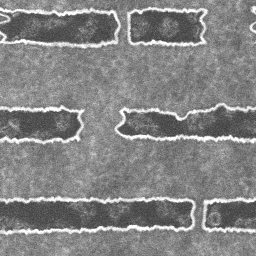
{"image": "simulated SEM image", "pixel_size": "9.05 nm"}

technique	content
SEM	one or a few lines or trenches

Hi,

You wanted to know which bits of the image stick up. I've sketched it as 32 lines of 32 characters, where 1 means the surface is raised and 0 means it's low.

00000000000000000000000000000000
11111000111111001111111111000000
01111111111111101111111110000000
11111111111111101111111111000001
11111111111111101111111110000000
00000111111110000000011110000000
00000000000000000000000000000000
00000000000000000000000000000000
00000000000000000000000000000000
00000000000000000000000000000000
00000000000000000000000000000000
00000000000000000000000000000000
00000000000000000000000000000000
00000000000000000000000000011000
11111111110000011111110111111111
11111111110000011111111111111111
11111111110000011111111111111111
01101111100000000000000000000011
00000000000000000000000000000000
00000000000000000000000000000000
00000000000000000000000000000000
00000000000000000000000000000000
00000000000000000000000000000000
00000000000000000000000000000000
00000000000000000000000000000000
11111111111111111111111100111111
11111111111111111111111100111111
11111111111111111111111101111111
11111111111111110110111100111111
00000000000000000000000000000000
00000000000000000000000000000000
00000000000000000000000000000000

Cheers